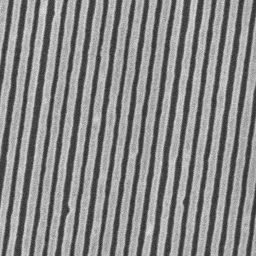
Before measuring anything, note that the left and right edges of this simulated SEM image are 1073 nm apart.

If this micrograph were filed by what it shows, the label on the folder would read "parallel lines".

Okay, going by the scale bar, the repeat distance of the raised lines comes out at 56.3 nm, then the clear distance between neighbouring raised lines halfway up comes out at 5.68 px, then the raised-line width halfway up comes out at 0.0321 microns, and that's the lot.